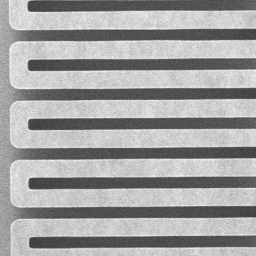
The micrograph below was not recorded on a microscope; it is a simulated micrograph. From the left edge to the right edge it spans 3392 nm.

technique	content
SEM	groups of lines, slits or small figures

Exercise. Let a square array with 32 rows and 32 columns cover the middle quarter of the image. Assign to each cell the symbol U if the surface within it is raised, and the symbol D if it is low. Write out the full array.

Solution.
DDDDDDDDDDDDDDDDDDDDDDDDDDDDDDDD
DDDDDDDDDDDDDDDDDDDDDDDDDDDDDDDD
UUUUUUUUUUUUUUUUUUUUUUUUUUUUUUUU
UUUUUUUUUUUUUUUUUUUUUUUUUUUUUUUU
UUUUUUUUUUUUUUUUUUUUUUUUUUUUUUUU
UUUUUUUUUUUUUUUUUUUUUUUUUUUUUUUU
DDDDDDDDDDDDDDDDDDDDDDDDDDDDDDDD
DDDDDDDDDDDDDDDDDDDDDDDDDDDDDDDD
DDDDDDDDDDDDDDDDDDDDDDDDDDDDDDDD
UUUUUUUUUUUUUUUUUUUUUUUUUUUUUUUU
UUUUUUUUUUUUUUUUUUUUUUUUUUUUUUUU
UUUUUUUUUUUUUUUUUUUUUUUUUUUUUUUU
UUUUUUUUUUUUUUUUUUUUUUUUUUUUUUUU
DDDDDDDDDDDDDDDDDDDDDDDDDDDDDDDD
DDDDDDDDDDDDDDDDDDDDDDDDDDDDDDDD
DDDDDDDDDDDDDDDDDDDDDDDDDDDDDDDD
DDDDDDDDDDDDDDDDDDDUUUUUUUUUUUUU
UUUUUUUUUUUUUUUUUUUUUUUUUUUUUUUU
UUUUUUUUUUUUUUUUUUUUUUUUUUUUUUUU
UUUUUUUUUUUUUUUUUUUUUUUUUUUUUUUU
UUUUUUUUUUUUUUUUUUUUUUUUUUUUUUUU
DDDDDDDDDDDDDDDDDDDDDDDDDDDDDDDD
DDDDDDDDDDDDDDDDDDDDDDDDDDDDDDDD
DDDDDDDDDDDDDDDDDDDDDDDDDDDDDDDD
UUUUUUUUUUUUUUUUUUUUUUUUUUUUUUUU
UUUUUUUUUUUUUUUUUUUUUUUUUUUUUUUU
UUUUUUUUUUUUUUUUUUUUUUUUUUUUUUUU
UUUUUUUUUUUUUUUUUUUUUUUUUUUUUUUU
DDDDDDDDDDDDDDDDDDDDDDDDDDDDDDDD
DDDDDDDDDDDDDDDDDDDDDDDDDDDDDDDD
DDDDDDDDDDDDDDDDDDDDDDDDDDDDDDDD
DDDDDDDDDDDUUUUUUUUUUUUUUUUUUUUU